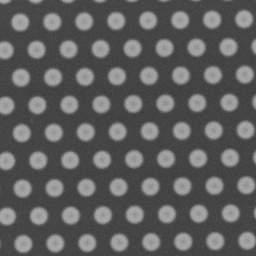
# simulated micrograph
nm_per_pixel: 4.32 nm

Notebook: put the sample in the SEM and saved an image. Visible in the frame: an array of small figures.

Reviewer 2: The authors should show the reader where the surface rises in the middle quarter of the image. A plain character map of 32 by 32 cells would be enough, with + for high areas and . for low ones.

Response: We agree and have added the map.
................................
....+++.....+++.....+++.....+++.
...++++....++++....++++....++++.
...++++....++++....++++....++++.
....+++.....+++.....+++.....+++.
................................
................................
................................
+++.....+++.....+++.....+++.....
+++....++++....++++....++++....+
+++....++++....++++....++++....+
+++.....+++.....+++.....+++.....
................................
................................
................................
....+++.....+++.....+++.....+++.
...+++++...++++....++++....++++.
...+++++...++++....++++.....+++.
....+++.....+++.....+++.....+++.
................................
................................
................................
+++.....+++.....+++.....+++.....
++++...+++++....++++...+++++...+
++++....++++....+++.....+++.....
+++.....+++.....+++.....+++.....
................................
................................
................................
....+++.....+++.....+++.....+++.
....++++....++++....++++....++++
....++++....++++....++++....++++